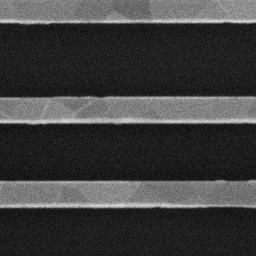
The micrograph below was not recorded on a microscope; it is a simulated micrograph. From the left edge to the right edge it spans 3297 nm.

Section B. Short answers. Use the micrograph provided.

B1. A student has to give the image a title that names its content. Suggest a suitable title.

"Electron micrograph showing lines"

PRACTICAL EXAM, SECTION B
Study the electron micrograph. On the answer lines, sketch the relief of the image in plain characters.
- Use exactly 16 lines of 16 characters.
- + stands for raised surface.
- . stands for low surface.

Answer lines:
++++++++++++++++
................
................
................
................
................
++++++++++++++++
++++++++++++++++
................
................
................
++++++++++++++++
++++++++++++++++
................
................
................